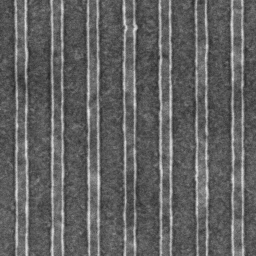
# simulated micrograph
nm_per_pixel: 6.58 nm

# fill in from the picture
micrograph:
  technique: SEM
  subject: parallel lines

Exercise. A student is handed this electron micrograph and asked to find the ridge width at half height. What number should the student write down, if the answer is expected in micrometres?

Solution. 0.065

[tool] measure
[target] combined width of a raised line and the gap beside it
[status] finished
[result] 237 nm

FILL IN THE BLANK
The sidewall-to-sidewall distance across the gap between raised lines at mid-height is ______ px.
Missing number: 25.9